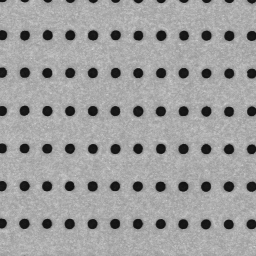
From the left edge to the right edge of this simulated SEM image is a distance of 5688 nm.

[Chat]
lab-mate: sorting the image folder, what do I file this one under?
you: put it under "a regular array of holes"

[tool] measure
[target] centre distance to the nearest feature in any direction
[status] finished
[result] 500 nm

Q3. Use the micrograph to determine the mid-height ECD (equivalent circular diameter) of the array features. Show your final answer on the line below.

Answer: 0.228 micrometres